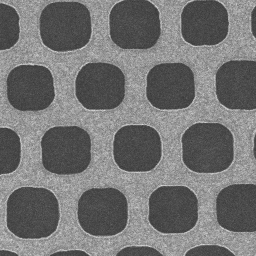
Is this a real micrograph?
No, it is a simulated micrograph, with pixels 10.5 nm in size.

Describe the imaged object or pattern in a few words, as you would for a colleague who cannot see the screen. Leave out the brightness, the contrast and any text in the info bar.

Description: a regular array of holes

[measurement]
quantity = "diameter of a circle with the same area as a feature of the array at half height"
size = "542 nanometres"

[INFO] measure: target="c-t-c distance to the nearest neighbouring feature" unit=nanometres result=741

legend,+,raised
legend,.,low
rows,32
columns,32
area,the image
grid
.+++++....+++++....++++.....++++
..+++......+++......+++.....++++
..+++......+++......+++......++.
..+++.......++......+++......++.
..+++......+++......+++.....++++
..++++.....+++.....+++++...+++++
++++++++++++++++++++++++++++++++
++++++++++++++++++++++++++++++++
++....++++.....++++.....+++.....
+......+++......++......+++.....
+......++.......++......+++.....
+......++.......++......+++.....
+......+++.....++++.....+++.....
++....+++++...++++++...+++++....
++++++++++++++++++++++++++++++++
++++++++++++++++++++++++....++++
..++++.....++++.....+++......+++
..+++......+++......+++......+++
...++......+++......+++......+++
...++......+++......+++......+++
..+++......++++.....+++......+++
.+++++....++++++..++++++...+++++
++++++++++++++++++++++++++++++++
+++..+++++++..++++++...+++++....
+......+++......+++.....+++.....
+......+++......+++......++.....
+......+++......+++......++.....
+......+++......+++......++.....
+......+++......+++.....++++....
++....++++++.+++++++++++++++++++
++++++++++++++++++++++++++++++++
..+++++...+++++.....+++......+++